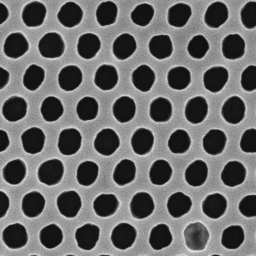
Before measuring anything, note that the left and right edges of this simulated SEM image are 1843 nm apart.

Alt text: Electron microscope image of a regular array of holes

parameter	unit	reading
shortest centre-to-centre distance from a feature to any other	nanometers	258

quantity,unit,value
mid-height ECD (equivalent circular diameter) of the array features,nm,176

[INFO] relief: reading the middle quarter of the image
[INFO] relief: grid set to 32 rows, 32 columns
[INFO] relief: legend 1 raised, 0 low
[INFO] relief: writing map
10011111100011111110011111111111
00001111000001111100001111000001
00001111000001111000000111000000
00000111000000111000000111000000
00001111000001111000001111000001
00001111000001111100001111000001
00111111110111111110011111110111
11111111111111111111111111111111
11111000111111000111111101111111
11110000111110000011110000111110
11100000011100000011100000011100
11100000011100000011100000011100
11100000111100000011100000011100
11110000111110000111110000011110
11111111111111001111111001111111
11111111111111111111111111111111
00011111100011111100011111111011
00001111000001111000001111100001
00000111000000111000001111000001
00001110000000111000001111000000
00001110000000111000001111000001
00001111000001111000011111000001
00011111100011111100111111111111
11111111111111111111111111111111
11111001111111000111111000111111
11110000111110000011110000011110
11100000011110000011110000011110
11100000111100000011100000011100
11100000111100000111110000111100
11110001111110001111110000111110
11111111111111111111111111111111
11111111111111111111111111111111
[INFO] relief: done